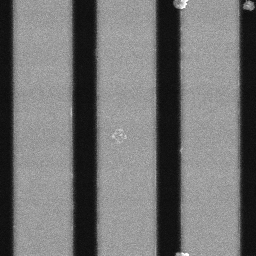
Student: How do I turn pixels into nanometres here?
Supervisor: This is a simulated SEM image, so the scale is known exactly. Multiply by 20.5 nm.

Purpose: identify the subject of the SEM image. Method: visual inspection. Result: one or a few lines or trenches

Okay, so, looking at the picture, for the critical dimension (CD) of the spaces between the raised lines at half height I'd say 1180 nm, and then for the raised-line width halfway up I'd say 536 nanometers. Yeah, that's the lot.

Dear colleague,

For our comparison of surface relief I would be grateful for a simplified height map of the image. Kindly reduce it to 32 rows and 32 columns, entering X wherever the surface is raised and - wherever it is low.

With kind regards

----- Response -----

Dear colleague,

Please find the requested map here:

XX-------XXX-------XXXX-------XX
XX-------XXX-------XXXX-------XX
XX-------XXX-------XXXX-------XX
XX-------XXX-------XXXX-------XX
XX-------XXX-------XXXX-------XX
XX-------XXX-------XXXX-------XX
XX-------XXX-------XXXX-------XX
XX-------XXX-------XXXX-------XX
XX-------XXX-------XXXX-------XX
XX-------XXX-------XXXX-------XX
XX-------XXX-------XXXX-------XX
XX-------XXX-------XXXX-------XX
XX-------XXX-------XXXX-------XX
XX-------XXX-------XXXX-------XX
XX-------XXX--------XXX-------XX
XX-------XXX--------XXX-------XX
XX-------XXX--------XXX-------XX
XX-------XXX--------XXX-------XX
XX-------XXX--------XXX-------XX
XX-------XXX--------XXX-------XX
XX-------XXX-------XXXX-------XX
XX-------XXX--------XXX-------XX
XX-------XXX-------XXXX-------XX
XX-------XXX--------XXX-------XX
XX-------XXX--------XXX-------XX
XX-------XXX--------XXX-------XX
XX-------XXX--------XXX-------XX
XX-------XXX--------XXX-------XX
XX-------XXX--------XXX-------XX
XX-------XXX--------XXX-------XX
XX-------XXX--------XXX-------XX
XX-------XXX-------XXXX-------XX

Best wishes